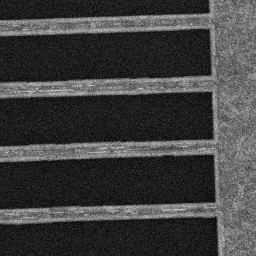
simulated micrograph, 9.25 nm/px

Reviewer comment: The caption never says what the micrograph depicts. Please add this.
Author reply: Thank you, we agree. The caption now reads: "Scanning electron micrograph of one or a few lines or trenches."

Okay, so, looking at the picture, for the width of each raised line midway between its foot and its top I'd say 97.1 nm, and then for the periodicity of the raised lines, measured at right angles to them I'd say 581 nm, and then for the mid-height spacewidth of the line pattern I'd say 477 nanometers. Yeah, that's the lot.